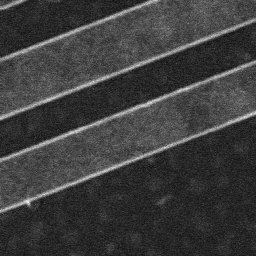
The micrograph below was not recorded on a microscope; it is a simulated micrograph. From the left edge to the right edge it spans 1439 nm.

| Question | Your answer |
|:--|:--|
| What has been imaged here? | one or a few lines or trenches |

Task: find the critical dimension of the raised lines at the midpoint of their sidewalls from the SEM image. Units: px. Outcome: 48.7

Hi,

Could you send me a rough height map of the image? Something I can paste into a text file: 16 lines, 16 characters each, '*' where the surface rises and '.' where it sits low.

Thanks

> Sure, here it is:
........********
......*********.
...**********...
.*********......
********......**
*****.......****
**.......*******
......*********.
....********....
.*********......
*******.........
*****...........
**..............
................
................
................